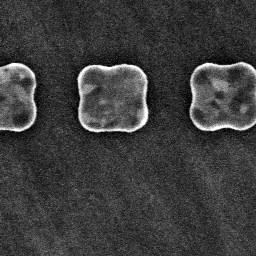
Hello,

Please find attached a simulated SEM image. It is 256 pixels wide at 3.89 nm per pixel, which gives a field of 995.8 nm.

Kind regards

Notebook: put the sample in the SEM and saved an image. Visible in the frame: raised bodies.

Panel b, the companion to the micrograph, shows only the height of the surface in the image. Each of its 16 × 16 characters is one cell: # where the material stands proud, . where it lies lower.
................
................
................
................
##...####...####
##...####...####
##...####...####
##...####...####
................
................
................
................
................
................
................
................